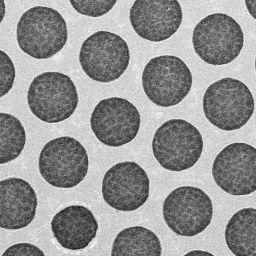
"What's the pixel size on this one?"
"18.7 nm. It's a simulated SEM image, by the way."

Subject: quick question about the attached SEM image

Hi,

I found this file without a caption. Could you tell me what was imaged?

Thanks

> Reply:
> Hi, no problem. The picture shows a regular array of holes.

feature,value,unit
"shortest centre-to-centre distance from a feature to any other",1230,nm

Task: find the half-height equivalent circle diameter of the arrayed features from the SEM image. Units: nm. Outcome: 958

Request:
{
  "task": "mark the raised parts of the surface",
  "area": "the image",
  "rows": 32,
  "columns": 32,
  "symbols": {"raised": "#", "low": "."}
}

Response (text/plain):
.########.....###.....#########.
.##....###....##.......########.
##......########.......##....###
##......#########.....##......##
##......###....##....###......##
##......##......########......##
###....###......########......##
.#########......###....##....###
..########......##......########
..###...###....###......########
..##.....#########......##.....#
.##.......########......##.....#
###.......###...###....##.......
####......##.....########.......
..##.....##......#########.....#
...########.......##....###....#
...#########.....##......#######
...###....##.....##......#######
...##......########......###....
..###......########......##.....
#####......####..###....###.....
#####......##.....#########.....
...###....###......########.....
....#########......###...###....
.....########......##.....######
.....########.....##......######
....###....#########.......###..
....###.....########......###...
...###......####..###.....##....
#######.....###.....###.####....
##..####...###......########....
#....#########......####..###...